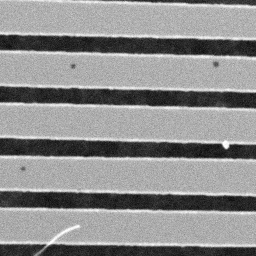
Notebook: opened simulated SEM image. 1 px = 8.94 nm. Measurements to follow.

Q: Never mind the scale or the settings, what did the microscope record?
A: lines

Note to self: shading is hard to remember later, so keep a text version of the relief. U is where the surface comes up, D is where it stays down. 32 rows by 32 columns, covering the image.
UUUUUUUUUUUUUUUUUUUUUUUUDDDDDDDD
UUUUUUUUUUUUUUUUUUUUUUUUUUUUUUUU
UUUUUUUUUUUUUUUUUUUUUUUUUUUUUUUU
UUUUUUUUUUUUUUUUUUUUUUUUUUUUUUUU
DDDDDDDDUUUUUUUUUUUUUUUUUUUUUUUU
DDDDDDDDDDDDDDDDDDDDDDDDDDDDDDDD
UUUUUUUUUDDDDDDDDDDDDDDDDDDDDDDD
UUUUUUUUUUUUUUUUUUUUUUUUUUUUUUUU
UUUUUUUUUUUUUUUUUUUUUUUUUUUUUUUU
UUUUUUUUUUUUUUUUUUUUUUUUUUUUUUUU
UUUUUUUUUUUUUUUUUUUUUUUUUUUUUUUU
DDDDDDDDDDDDDDDDDDDDDDDDDDDDDDDD
DDDDDDDDDDDDDDDDDDDDDDDDDDDDDDDD
UUUUUUUUUUUUUUUUUUUUUUUUUUUUUDDD
UUUUUUUUUUUUUUUUUUUUUUUUUUUUUUUU
UUUUUUUUUUUUUUUUUUUUUUUUUUUUUUUU
UUUUUUUUUUUUUUUUUUUUUUUUUUUUUUUU
DDDDDDDDDDUUUUUUUUUUUUUUUUUUUUUU
DDDDDDDDDDDDDDDDDDDDDDDDDDDDDDDD
DDDDDDDDDDDDDDDDDDDDDDDDDDDDDDDD
UUUUUUUUUUUUUUUUUUUUUUUUUUUUUUUU
UUUUUUUUUUUUUUUUUUUUUUUUUUUUUUUU
UUUUUUUUUUUUUUUUUUUUUUUUUUUUUUUU
UUUUUUUUUUUUUUUUUUUUUUUUUUUUUUUU
DDDDDDDDDDDDDDDDDDDDDDDDDDDDDDUU
DDDDDDDDDDDDDDDDDDDDDDDDDDDDDDDD
UUUUUUUUUUUUUUUUUUUUUUUUUUUUDDDD
UUUUUUUUUUUUUUUUUUUUUUUUUUUUUUUU
UUUUUUUUUUUUUUUUUUUUUUUUUUUUUUUU
UUUUUUUUUUUUUUUUUUUUUUUUUUUUUUUU
DDDDDUUDUUUUUUUUUUUUUUUUUUUUUUUU
DDDDDDDDDDDDDDDDDDDDDDDDDDDDDDDD